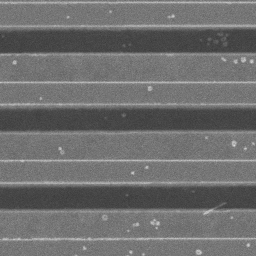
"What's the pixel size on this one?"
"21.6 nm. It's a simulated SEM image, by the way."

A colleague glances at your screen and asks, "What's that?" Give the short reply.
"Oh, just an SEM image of lines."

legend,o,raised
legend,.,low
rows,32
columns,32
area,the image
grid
oooooooooooooooooooooooooooooooo
oooooooooooooooooooooooooooooooo
oooooooooooooooooooooooooooooooo
................................
................................
................................
................................
oooooooooooooooooooooooooooooooo
oooooooooooooooooooooooooooooooo
oooooooooooooooooooooooooooooooo
oooooooooooooooooooooooooooooooo
oooooooooooooooooooooooooooooooo
oooooooooooooooooooooooooooooooo
................................
................................
................................
................................
oooooooooooooooooooooooooooooooo
oooooooooooooooooooooooooooooooo
oooooooooooooooooooooooooooooooo
oooooooooooooooooooooooooooooooo
oooooooooooooooooooooooooooooooo
oooooooooooooooooooooooooooooooo
................................
................................
................................
oooooooooooooooooooooooooooooooo
oooooooooooooooooooooooooooooooo
oooooooooooooooooooooooooooooooo
oooooooooooooooooooooooooooooooo
oooooooooooooooooooooooooooooooo
oooooooooooooooooooooooooooooooo